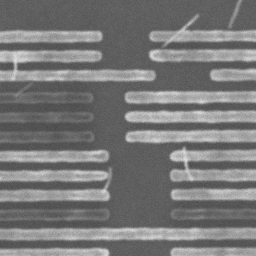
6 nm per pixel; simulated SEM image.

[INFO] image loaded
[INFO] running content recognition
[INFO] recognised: wiring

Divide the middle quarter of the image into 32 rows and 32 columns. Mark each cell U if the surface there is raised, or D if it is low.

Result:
DDDDDDDDDDDDDDDDDDDDDDDDDDDDDDDD
DDDDDDDDDDDDDDDDDDDDDDDDDDDDDDDD
UUUUUUUUUUUUUUUUUUUUUUUDDDDDDDDD
UUUUUUUUUUUUUUUUUUUUUUUDDDDDDDDD
DDDDDDDDDDDDDDDDDDDDDDDDDDDDDDDD
DDDDDDDDDDDDDDDDDDDDDDDDDDDDDDDD
DDDDDDDDDDDDDDDDDDDDDDDDDDDDDDDD
UUUUUUUDDDDDDDDDUUUUUUUUUUUUUUUU
UUUUUUUDDDDDDDDDUUUUUUUUUUUUUUUU
DDDDDDDDDDDDDDDDDUUUUDDDUUDDDUUD
DDDDDDDDDDDDDDDDDDDDDDDDDDDDDDDD
DDDDDDDDDDDDDDDDDDDDDDDDDDDDDDDD
UUUUUUUDDDDDDDDDUUUUUUUUUUUUUUUU
UUUUUUUDDDDDDDDDUUUUUUUUUUUUUUUU
DUUUUDDDDDDDDDDDDDDDDUUUUUUDDDDD
DDDDDDDDDDDDDDDDDDDDDDDDDDDDDDDD
DDDDDDDDDDDDDDDDDDDDDDDDDDDDDDDD
UUUUUUUDDDDDDDDDUUUUUUUUUUUUUUUU
UUUUUUUDDDDDDDDDUUUUUUUUUUUUUUUU
DDDDDDDDDDDDDDDDDDDDDDUUUDDDDDDD
DDDDDDDDDDDDDDDDDDDDDDDDDDDDDDDD
DDDDDDDDDDDDDDDDDDDDDDDDDDDDDUDD
UUUUUUUUUUUDDDDDDDDDDDDDDDDUUUUU
UUUUUUUUUUUDDDDDDDDDDDDDDDDUUUUU
DDDDDDDDDDDDDDDDDDDDDDDDDDDDDDUD
DDDDDDDDDDDDDDDDDDDDDDDDDDDDDDDD
DDDDDDDDDDDDDDDDDDDDDDDDDDDDDDUD
UUUUUUUUUUUDDDDDDDDDDDDDDDDUUUUU
UUUUUUUUUUDDDDDDDDDDDDDDDDDUUUUU
DDDDDDDDDDDDDDDDDDDDDDDDDDDDDDDD
DDDDDDDDDDDDDDDDDDDDDDDDDDDDDDDD
DDDDDDDDDDDDDDDDDDDDDDDDDDDDDDDD